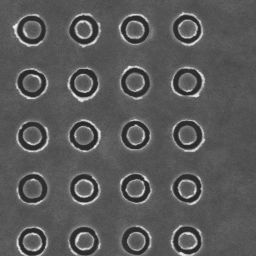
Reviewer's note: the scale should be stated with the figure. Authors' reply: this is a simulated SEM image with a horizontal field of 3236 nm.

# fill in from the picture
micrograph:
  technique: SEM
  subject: a regular array of ring-shaped grooves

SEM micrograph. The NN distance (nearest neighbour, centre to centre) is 0.65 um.